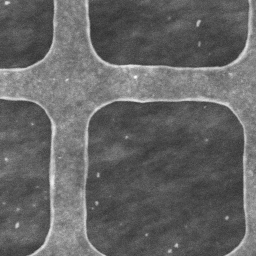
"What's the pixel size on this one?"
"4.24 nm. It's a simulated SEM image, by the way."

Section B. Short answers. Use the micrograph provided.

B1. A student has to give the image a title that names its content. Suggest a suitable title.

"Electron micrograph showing holes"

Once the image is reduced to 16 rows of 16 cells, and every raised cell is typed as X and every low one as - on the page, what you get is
---XX-----------
---XXX----------
---XXX---------X
---XXX---------X
XXXXXXXXXXXXXXXX
XXXXXXXXXXXXXXXX
--XXXXX-------XX
---XXX---------X
---XX----------X
---XX----------X
---XX----------X
---XX----------X
---XX----------X
---XX----------X
---XX----------X
--XXXX---------X